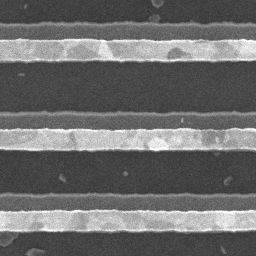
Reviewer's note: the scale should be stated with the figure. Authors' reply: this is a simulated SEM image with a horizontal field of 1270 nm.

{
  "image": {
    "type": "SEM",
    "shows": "lines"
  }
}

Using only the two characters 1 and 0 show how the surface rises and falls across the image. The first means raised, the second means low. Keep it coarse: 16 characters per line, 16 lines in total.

0000000000000000
0011110111010111
1111111111111111
1111111111111111
0000000000000000
0000000000000000
0000000000000000
1111111111111111
1111111111111111
0000000000000000
0000000000000000
0000000000000000
1111111111111111
1111111111111111
0000000000000000
0000000000000000